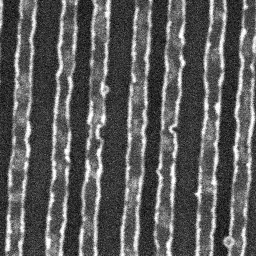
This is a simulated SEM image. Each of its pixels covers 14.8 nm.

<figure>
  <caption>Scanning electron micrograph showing parallel lines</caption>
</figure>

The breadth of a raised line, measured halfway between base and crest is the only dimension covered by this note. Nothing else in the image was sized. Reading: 227 nm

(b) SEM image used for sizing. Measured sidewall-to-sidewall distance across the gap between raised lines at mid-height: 327 nm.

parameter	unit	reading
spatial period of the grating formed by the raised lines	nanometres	551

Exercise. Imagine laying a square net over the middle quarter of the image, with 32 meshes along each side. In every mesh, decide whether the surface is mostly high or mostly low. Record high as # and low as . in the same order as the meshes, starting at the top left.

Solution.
###....###.......####.....####..
##.....####......####.....###...
##.....###.......####....####...
##.....###.......####....####...
##.....###.......####....####...
##.....###.......####....####...
##.....####......###.....####...
##.....###.......###.....####...
#......###.......####....####...
#......###......#####....####...
#......###......####.....###....
#......###......####.....###....
#......###......####.....###....
#.....####......####.....###....
#.....####......####.....###....
#......###......####.....###....
#......##.......####.....##.....
#......##.......####....####....
#......##.......####....####....
#.....####......####....####....
#.....###.......####....####....
#.....###.......####....####....
#.....###.......####....####....
#.....###.......###.....####....
#.....###.......####....####....
#.....###.......####....####....
#.....###.......####....####....
#.....###.......####....####....
#.....###.......###.....###.....
#....####.......###.....####....
#....####.......###.....###.....
#....####.......###.....###.....